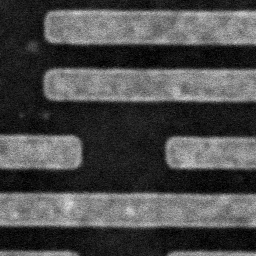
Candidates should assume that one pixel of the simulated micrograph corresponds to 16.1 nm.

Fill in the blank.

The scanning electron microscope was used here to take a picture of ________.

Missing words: wiring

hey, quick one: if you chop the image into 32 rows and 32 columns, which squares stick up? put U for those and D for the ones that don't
DDDDDDDDDDDDDDDDDDDDDDDDDDDDDDDD
DDDDDDDUUUUUUUUDDDDDDDDDDDDDDDDD
DDDDDDUUUUUUUUUUUUUUUUUUUUUUUUUU
DDDDDDUUUUUUUUUUUUUUUUUUUUUUUUUU
DDDDDDUUUUUUUUUUUUUUUUUUUUUUUUUU
DDDDDDDDDDDDDDDDDDDDDDDDDDDDDDDD
DDDDDDDDDDDDDDDDDDDDDDDDDDDDDDDD
DDDDDDDDDDDDDDDDDDDDDDDDDDDDDDDD
DDDDDDDDDDDDDDDDDDDDDDDDDDDDDDDD
DDDDDDUUUUUUUUUUUUUUUUUUUUUUUUUU
DDDDDDUUUUUUUUUUUUUUUUUUUUUUUUUU
DDDDDDUUUUUUUUUUUUUUUUUUUUUUUUUU
DDDDDDDDDDDDDDUUUUUDDDDDUUUUUUUU
DDDDDDDDDDDDDDDDDDDDDDDDDDDDDDDD
DDDDDDDDDDDDDDDDDDDDDDDDDDDDDDDD
DDDDDDDDDDDDDDDDDDDDDDDDDDDDDDDD
DDDDDDDDDDDDDDDDDDDDDDDDDDDDDDDD
UUUUUUUUUUDDDDDDDDDDDUUUUUUUUUUU
UUUUUUUUUUDDDDDDDDDDDUUUUUUUUUUU
UUUUUUUUUUDDDDDDDDDDDUUUUUUUUUUU
UUUUUUUUUUDDDDDDDDDDDUUUUUUUUUUU
DDDDDDDDDDDDDDDDDDDDDDDDDDDDDDDD
DDDDDDDDDDDDDDDDDDDDDDDDDDDDDDDD
DDDDDDDDDDDDDDDDDDDDDDDDDDDDDDDD
UUUUUUUUUUUUUUUUUUUUUUUUUUUUUUUU
UUUUUUUUUUUUUUUUUUUUUUUUUUUUUUUU
UUUUUUUUUUUUUUUUUUUUUUUUUUUUUUUU
UUUUUUUUUUUUUUUUUUUUUUUUUUUUUUUU
DDDDDDDDDDDDDDDDDDDDDDDDDDDDDDDD
DDDDDDDDDDDDDDDDDDDDDDDDDDDDDDDD
DDDDDDDDDDDDDDDDDDDDDDDDDDDDDDDD
UUUDDDDDDDDDDDDDDDDDDDDDDDDDDDDD